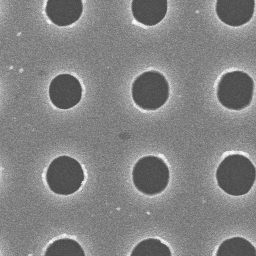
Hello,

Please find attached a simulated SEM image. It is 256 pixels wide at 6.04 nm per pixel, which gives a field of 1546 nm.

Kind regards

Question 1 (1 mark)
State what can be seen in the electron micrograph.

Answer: holes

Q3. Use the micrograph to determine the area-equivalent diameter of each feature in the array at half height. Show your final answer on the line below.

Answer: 37.8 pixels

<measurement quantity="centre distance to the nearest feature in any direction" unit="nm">512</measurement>